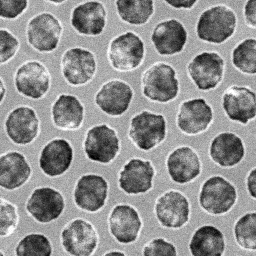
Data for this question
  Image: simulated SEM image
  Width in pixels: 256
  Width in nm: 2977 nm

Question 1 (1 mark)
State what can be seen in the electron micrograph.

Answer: a regular array of holes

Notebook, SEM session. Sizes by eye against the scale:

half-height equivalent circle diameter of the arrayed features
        408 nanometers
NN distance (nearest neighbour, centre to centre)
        538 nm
